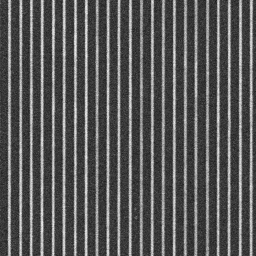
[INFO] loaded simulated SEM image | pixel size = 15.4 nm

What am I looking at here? parallel lines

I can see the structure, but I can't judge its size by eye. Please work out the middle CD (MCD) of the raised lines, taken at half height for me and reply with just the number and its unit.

28.8 nanometers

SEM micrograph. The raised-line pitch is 169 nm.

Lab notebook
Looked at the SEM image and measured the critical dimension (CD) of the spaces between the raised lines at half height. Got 146 nanometres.